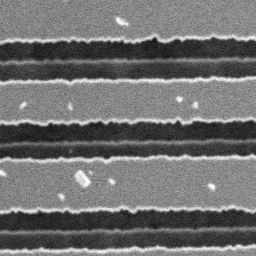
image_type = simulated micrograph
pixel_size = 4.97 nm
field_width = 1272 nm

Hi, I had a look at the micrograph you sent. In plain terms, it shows lines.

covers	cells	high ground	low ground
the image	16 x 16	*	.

****************
****************
*********.*.....
................
................
****************
****************
****************
................
................
****************
****************
****************
................
................
.........*..****